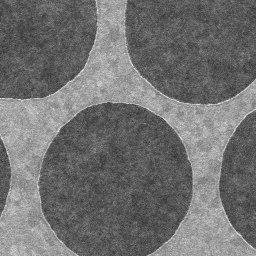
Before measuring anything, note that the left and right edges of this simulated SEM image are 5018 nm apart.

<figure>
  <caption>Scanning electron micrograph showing holes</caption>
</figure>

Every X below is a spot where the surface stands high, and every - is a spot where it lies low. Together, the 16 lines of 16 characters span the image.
------XX--------
------XX--------
------XX--------
------XX--------
-----XXXX-------
----XXXXXX-----X
XXXXXX--XXXX-XXX
XXXX------XXXXX-
XXX--------XXX--
XXX---------XX--
-XX---------XX--
-X----------XX--
XXX---------XX--
XXX---------XX--
XXX--------XXXX-
XXXX------XXXXXX